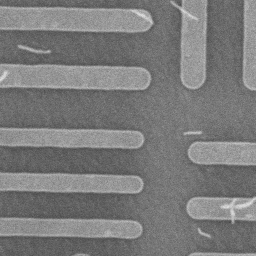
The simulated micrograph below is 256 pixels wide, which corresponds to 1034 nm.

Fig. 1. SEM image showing groups of lines, slits or small figures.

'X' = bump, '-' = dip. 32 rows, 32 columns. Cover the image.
-----------------------XXX-----X
XXXXXXXXXXXXXXXXXX-----XXX-----X
XXXXXXXXXXXXXXXXXXX----XXX-----X
XXXXXXXXXXXXXXXXXXX----XXX-----X
-----------------------XXX-----X
-----------------------XXX-----X
-----------------------XXX-----X
-----------------------XXX-----X
XXXXXXXXXXXXXXXX-------XXX-----X
XXXXXXXXXXXXXXXXXXX----XXX-----X
XXXXXXXXXXXXXXXXXXX----XX------X
--------------------------------
--------------------------------
--------------------------------
--------------------------------
--------------------------------
XXXXXXXXXXXXXXXXX---------------
XXXXXXXXXXXXXXXXXX--------------
------------------------XXXXXXXX
------------------------XXXXXXXX
-------------------------------X
--------------------------------
XXXXXXXXXXXXXXXXXX--------------
XXXXXXXXXXXXXXXXXX--------------
--------------------------------
------------------------XXXXXXXX
------------------------XXXXXXXX
XXXXXXXXXXXXXX------------------
XXXXXXXXXXXXXXXXXX--------------
----------XXXXXXX---------------
--------------------------------
--------------------------------